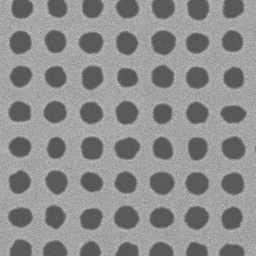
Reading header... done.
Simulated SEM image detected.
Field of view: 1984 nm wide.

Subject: a regular array of holes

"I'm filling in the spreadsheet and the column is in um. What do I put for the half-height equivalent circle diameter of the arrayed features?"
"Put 0.176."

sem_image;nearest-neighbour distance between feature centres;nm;268